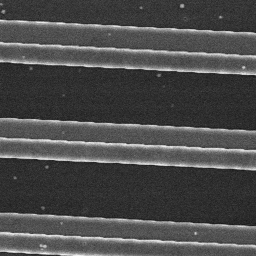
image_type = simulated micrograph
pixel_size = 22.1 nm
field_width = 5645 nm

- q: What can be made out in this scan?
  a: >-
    lines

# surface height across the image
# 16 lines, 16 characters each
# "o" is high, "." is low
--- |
................
oooo............
oooooooooooooooo
oooooooooooooooo
............oooo
................
................
ooo.............
oooooooooooooooo
oooooooooooooooo
..............oo
................
................
oooo............
oooooooooooooooo
oooooooooooooooo